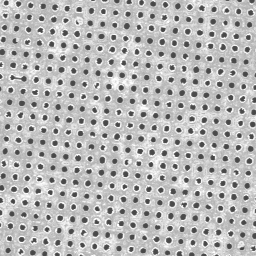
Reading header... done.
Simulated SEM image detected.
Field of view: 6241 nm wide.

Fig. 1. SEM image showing a regular array of holes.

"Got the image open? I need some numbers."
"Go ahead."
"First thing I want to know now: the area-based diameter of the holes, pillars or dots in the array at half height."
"5.64 px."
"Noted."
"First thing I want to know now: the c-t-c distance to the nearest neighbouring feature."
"291 nanometers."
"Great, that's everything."